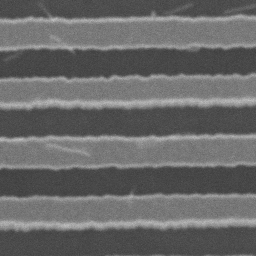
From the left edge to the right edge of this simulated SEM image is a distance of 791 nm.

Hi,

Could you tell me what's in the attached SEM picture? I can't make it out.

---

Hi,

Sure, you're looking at lines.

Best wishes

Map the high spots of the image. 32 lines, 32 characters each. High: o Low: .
................................
................................
oooooooooooooooooooooooooooooooo
oooooooooooooooooooooooooooooooo
oooooooooooooooooooooooooooooooo
oooooooooooooooooooooooooooooooo
................................
................................
................................
..............o....oo.o.oooooo.o
oooooooooooooooooooooooooooooooo
oooooooooooooooooooooooooooooooo
oooooooooooooooooooooooooooooooo
................................
................................
................................
................................
oooooooooooooooooooooooooooooooo
oooooooooooooooooooooooooooooooo
oooooooooooooooooooooooooooooooo
oooooooooooooooooooooooooooooooo
................................
................................
................................
.............oo.oooooooooooooooo
oooooooooooooooooooooooooooooooo
oooooooooooooooooooooooooooooooo
oooooooooooooooooooooooooooooooo
.........o......................
................................
................................
................................